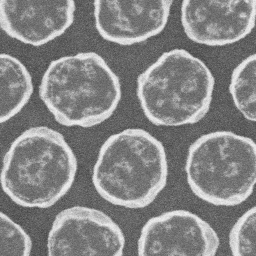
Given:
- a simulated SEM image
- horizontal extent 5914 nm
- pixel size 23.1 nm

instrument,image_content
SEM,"raised bodies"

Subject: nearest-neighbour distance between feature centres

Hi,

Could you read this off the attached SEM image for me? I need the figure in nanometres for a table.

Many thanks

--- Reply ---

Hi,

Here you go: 2100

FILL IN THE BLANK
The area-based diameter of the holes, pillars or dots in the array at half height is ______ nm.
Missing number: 1620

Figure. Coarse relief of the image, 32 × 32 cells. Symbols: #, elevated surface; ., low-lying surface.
#########...#########..#########
#########...#########..#########
#########...#########..########.
.#######....########...########.
..#####......#####......######..
....#...........................
................................
##......####........#####......#
###...#######......#######....##
###...########....########...###
####..########....########...###
####.##########...########...###
###...#########...########...###
##.....#######....#######.....##
#......######......#####.......#
.....................#..........
................#...............
..#####.......#####......######.
..######.....#######....########
.########....#######....########
.########...########....########
.########...########....########
#########...########....########
########....########....#######.
..#####.......#####......######.
...###..........................
...............................#
#.......#####.......#####.....##
##.....#######....########....##
###...#########...########...###
###...#########...########...###
###...#########...########....##